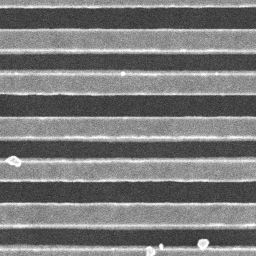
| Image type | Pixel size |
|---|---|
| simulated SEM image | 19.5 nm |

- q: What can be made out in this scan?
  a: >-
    lines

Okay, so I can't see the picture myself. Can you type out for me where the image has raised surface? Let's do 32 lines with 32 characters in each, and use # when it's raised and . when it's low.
################################
................................
................................
................................
################################
################################
................................
................................
................................
################################
################################
################################
................................
................................
................................
################################
################################
................................
................................
................................
################################
################################
################################
................................
................................
#########..###################.#
################################
################################
................................
................................
.........................#......
################################